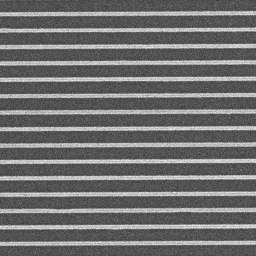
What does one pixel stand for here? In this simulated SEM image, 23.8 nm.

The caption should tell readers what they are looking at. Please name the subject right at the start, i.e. parallel lines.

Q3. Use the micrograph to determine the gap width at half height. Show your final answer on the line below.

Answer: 0.319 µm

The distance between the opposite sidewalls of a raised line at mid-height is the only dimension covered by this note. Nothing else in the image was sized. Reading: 65.5 nm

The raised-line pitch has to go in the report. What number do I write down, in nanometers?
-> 390